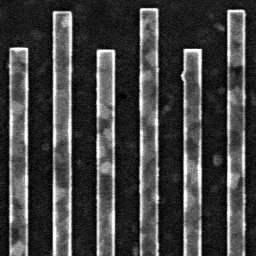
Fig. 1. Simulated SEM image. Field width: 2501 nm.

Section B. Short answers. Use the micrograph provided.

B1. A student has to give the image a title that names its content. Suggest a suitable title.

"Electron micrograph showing parallel lines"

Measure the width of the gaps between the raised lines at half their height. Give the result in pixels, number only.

26.9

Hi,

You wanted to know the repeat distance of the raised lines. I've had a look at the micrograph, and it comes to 425 nm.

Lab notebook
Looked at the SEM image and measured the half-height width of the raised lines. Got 166 nm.